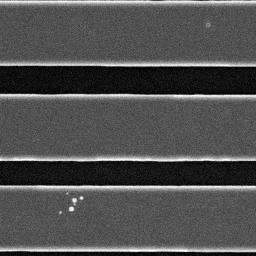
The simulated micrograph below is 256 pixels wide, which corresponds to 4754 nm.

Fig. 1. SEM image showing lines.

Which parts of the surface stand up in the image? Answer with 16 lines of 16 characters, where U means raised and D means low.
UUUUUUUUUUUUUUUU
UUUUUUUUUUUUUUUU
UUUUUUUUUUUUUUUU
UUUUUUUUUUUUUUUU
DDDDDDDDDDDDDDDD
DDDDDDDDDDDDDDDD
UUUUUUUUUUUUUUUU
UUUUUUUUUUUUUUUU
UUUUUUUUUUUUUUUU
UUUUUUUUUUUUUUUU
DDDDDDDDDDDDDDDD
DDDDDDDDDDDDDDDD
UUUUUUUUUUUUUUUU
UUUUUUUUUUUUUUUU
UUUUUUUUUUUUUUUU
UUUUUUUUUUUUUUUU